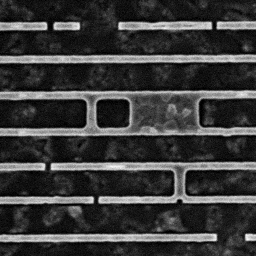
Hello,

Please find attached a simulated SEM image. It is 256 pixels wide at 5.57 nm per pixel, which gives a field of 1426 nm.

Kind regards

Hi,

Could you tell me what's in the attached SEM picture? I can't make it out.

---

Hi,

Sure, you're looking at parallel lines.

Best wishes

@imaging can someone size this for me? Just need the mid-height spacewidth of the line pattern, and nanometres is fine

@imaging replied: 162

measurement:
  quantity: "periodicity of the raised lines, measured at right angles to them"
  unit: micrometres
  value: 0.197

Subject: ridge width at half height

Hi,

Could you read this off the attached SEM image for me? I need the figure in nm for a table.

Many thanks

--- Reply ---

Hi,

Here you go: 39